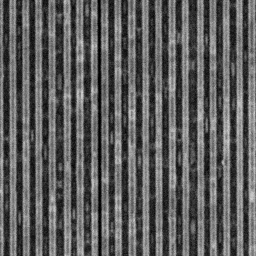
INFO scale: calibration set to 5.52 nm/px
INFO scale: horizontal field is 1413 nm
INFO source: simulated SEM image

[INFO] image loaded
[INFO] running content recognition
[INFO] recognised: parallel lines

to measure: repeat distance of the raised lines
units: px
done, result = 13.3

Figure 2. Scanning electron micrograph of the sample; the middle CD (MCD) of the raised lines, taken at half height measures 34.5 nm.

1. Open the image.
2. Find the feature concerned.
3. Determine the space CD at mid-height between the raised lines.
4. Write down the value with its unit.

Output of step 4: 40 nanometers